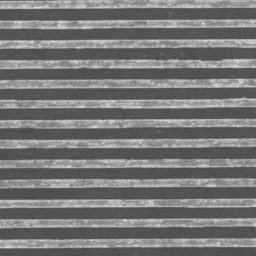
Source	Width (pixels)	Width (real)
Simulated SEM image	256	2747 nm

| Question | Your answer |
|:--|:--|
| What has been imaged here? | parallel lines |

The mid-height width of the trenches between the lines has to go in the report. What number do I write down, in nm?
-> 137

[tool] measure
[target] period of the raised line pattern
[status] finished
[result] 19.9 px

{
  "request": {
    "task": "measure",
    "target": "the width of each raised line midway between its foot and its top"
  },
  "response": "73.7 nm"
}